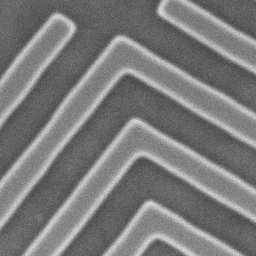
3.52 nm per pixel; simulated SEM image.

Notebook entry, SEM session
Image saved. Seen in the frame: groups of lines, slits or small figures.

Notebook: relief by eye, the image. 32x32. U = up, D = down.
DDDDDDDDDDDDDDDDDDDDUUUUDDDDDDDD
DDDDDDDDDDDDDDDDDDDDUUUUUUDDDDDD
DDDDDDUUUDDDDDDDDDDDDUUUUUUDDDDD
DDDDDUUUUDDDDDDDDDDDDDDUUUUUUDDD
DDDDDUUUUDDDDDDDDDDDDDDDUUUUUUUD
DDDDUUUUDDDDDDUUUDDDDDDDDDUUUUUU
DDDUUUUDDDDDDUUUUUUDDDDDDDDUUUUU
DDUUUUDDDDDDUUUUUUUUDDDDDDDDDUUU
DUUUUUDDDDDUUUUUUUUUUUDDDDDDDDDU
DUUUUDDDDDDUUUUDDUUUUUUUDDDDDDDD
UUUUDDDDDDUUUUDDDDDUUUUUUDDDDDDD
UUUDDDDDDUUUUDDDDDDDDUUUUUUDDDDD
UUUDDDDDUUUUUDDDDDDDDDUUUUUUUDDD
UUDDDDDUUUUUDDDDDDDDDDDDUUUUUUDD
UDDDDDDUUUUDDDDDDDDDDDDDDUUUUUUU
DDDDDDUUUUDDDDDDUUDDDDDDDDDUUUUU
DDDDDUUUUDDDDDDUUUUUDDDDDDDDDUUU
DDDDDUUUDDDDDDUUUUUUUDDDDDDDDDUU
DDDDUUUUDDDDDDUUUUUUUUUDDDDDDDDD
DDDUUUUDDDDDDUUUUDUUUUUUUDDDDDDD
DDUUUUDDDDDDUUUUDDDDUUUUUUDDDDDD
DUUUUDDDDDDUUUUDDDDDDDUUUUUUDDDD
UUUUUDDDDDDUUUUDDDDDDDDUUUUUUUDD
UUUUDDDDDDUUUUDDDDDDDDDDDUUUUUUD
UUUDDDDDDUUUUDDDDDDDDDDDDDDUUUUU
UUDDDDDDUUUUDDDDDDUDDDDDDDDDUUUU
UUDDDDDUUUUUDDDDDUUUUDDDDDDDDDUU
UDDDDDDUUUUDDDDDDUUUUUUDDDDDDDDD
DDDDDDUUUUDDDDDDUUUUUUUUDDDDDDDD
DDDDDUUUUDDDDDDUUUUUUUUUUUDDDDDD
DDDDUUUUDDDDDDUUUUDDDUUUUUUUDDDD
DDDUUUUUDDDDDUUUUUDDDDDUUUUUUDDD